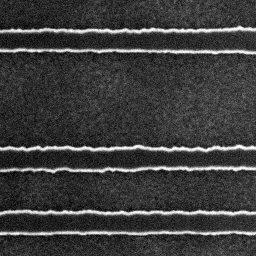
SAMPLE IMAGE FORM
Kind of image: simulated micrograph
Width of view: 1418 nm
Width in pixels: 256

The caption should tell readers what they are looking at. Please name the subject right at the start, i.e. lines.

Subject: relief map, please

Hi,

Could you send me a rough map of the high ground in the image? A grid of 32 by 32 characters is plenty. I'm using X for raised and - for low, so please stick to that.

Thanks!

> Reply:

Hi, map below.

--------------------------------
--------------------------------
--------------------------------
-----------------------------XX-
XXXXXXXXXXXXXXXXXXXXXXXXXXXXXXXX
XXXXXXXXXXXXXXXXXXXXXXXXXXXXXXXX
------------X-------XXXXXXXXXXXX
--------------------------------
--------------------------------
--------------------------------
--------------------------------
--------------------------------
--------------------------------
--------------------------------
--------------------------------
--------------------------------
--------------------------------
--------------------------------
-XX-XXXXX-X---XXXXX-------XXXXXX
XXXXXXXXXXXXXXXXXXXXXXXXXXXXXXXX
XXXXXXXXXXXXXXXXXXXXXXXXXXXXXXXX
------X-------------------------
--------------------------------
--------------------------------
--------------------------------
--------------------------------
-XXXX-X-XXXX-----X-X-XX-XX----X-
XXXXXXXXXXXXXXXXXXXXXXXXXXXXXXXX
XXXXXXXXXXXXXXXXXXXXXXXXXXXXXXXX
--------------------------------
--------------------------------
--------------------------------